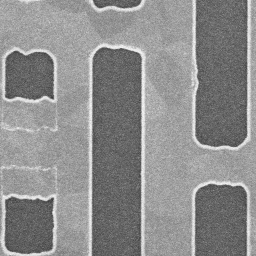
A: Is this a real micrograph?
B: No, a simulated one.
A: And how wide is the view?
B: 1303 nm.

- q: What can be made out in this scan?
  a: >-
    one or a few lines or trenches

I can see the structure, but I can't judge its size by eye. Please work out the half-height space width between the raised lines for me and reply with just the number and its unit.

52.5 px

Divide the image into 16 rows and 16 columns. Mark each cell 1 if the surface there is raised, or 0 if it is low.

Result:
1111110011110000
1111111111110000
1111111111110000
0001110001110000
0001110001110000
0001110001110000
1111110001110000
1111110001110000
1111110001110001
1111110001111111
1111110001111111
1111110001111011
0001110001110001
0001110001110000
0001110001110000
0001110001110000